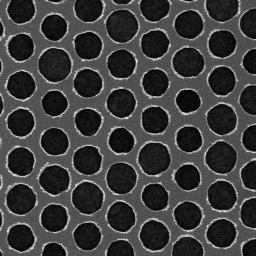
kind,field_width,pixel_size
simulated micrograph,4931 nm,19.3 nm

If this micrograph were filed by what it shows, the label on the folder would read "a regular array of holes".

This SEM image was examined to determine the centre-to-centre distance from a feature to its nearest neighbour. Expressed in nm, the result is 724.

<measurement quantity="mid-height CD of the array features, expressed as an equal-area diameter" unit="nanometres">543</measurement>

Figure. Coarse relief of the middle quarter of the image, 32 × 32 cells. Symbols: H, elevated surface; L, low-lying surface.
LLHHHHHHHHHLLLLLLLHHHHHHHHHLLLLL
LLHHLLLHHHHLLLLLLHHHHLLLHHHHLLLL
LHHLLLLLLHHHLLLLLHHHLLLLLHHHHLLL
HHHLLLLLLHHHHLLLHHHHLLLLLLHHHHHH
HHLLLLLLLLHHHHHHHHHHLLLLLLHHHHHH
HHLLLLLLLLHHHHHHHHHHLLLLLLHHHHHH
HHHLLLLLLHHHHLLLHHHHLLLLLLHHHHLL
HHHHLLLLLHHHLLLLLHHHHLLLLHHHHLLL
HHHHHLHHHHHLLLLLLLHHHHHHHHHHLLLL
LHHHHHHHHHHLLLLLLLHHHHHHHHHHLLLL
LHHHHHHHHHHLLLLLLLHHHHHHHHHHLLLL
HHHHLLLHHHHLLLLLLLHHLLLLLHHHHLLL
HHHLLLLLLHHHLLLLLHHHLLLLLLHHHHHH
HHHLLLLLLHHHHHLHHHHLLLLLLLHHHHHH
HHHLLLLLLHHHHHHHHHHLLLLLLLHHHHHH
HHHLLLLLLHHHHHHHHHHHLLLLLLHHHHHH
HHHHLLLLLHHHHLLLHHHHLLLLLHHHHLLL
HHHHLLLLHHHHLLLLLHHHHHHHHHHHLLLL
LHHHHHHHHHHLLLLLLHHHHHHHHHHHLLLL
LHHHHHHHHHHLLLLLLLHHHHHHHHHHLLLL
LHHHHLLHHHHLLLLLLHHHLLLLLHHHHLLL
LHHLLLLLHHHHLLLLLHHLLLLLLLHHHLLL
HHLLLLLLLHHHHHHHHHHLLLLLLLHHHHHH
HHLLLLLLLLHHHHHHHHHLLLLLLLLHHHHH
HHLLLLLLLHHHHHHHHHHLLLLLLLLHHHHH
HHHLLLLLLHHHLLLLLHHLLLLLLLHHHLLL
LHHLLLLLLHHLLLLLLLHHLLLLLLHHLLLL
LHHHHLLHHHHLLLLLLLHHHLLLHHHHLLLL
LHHHHHHHHHHLLLLLLLHHHHHHHHHHLLLL
LHHHHLLHHHHLLLLLLLHHHHHHHHHHLLLL
LHHLLLLLHHHLLLLLLLHHHLLLLHHHHLLL
LHLLLLLLLHHHLLLLLHHHLLLLLHHHHHLL